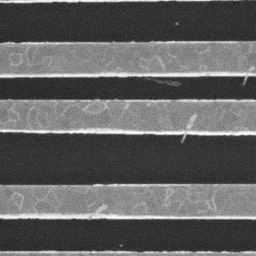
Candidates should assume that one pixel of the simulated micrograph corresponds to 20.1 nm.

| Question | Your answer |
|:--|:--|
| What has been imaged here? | lines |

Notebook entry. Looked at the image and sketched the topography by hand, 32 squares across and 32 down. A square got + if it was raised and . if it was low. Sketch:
................................
................................
................................
................................
................................
++++++++++++++++++++++++++++++++
++++++++++++++++++++++++++++++++
++++++++++++++++++++++++++++++++
++++++++++++++++++++++++++++++++
................................
................................
................................
................................
++++++++++++++++++++++++++++++++
++++++++++++++++++++++++++++++++
++++++++++++++++++++++++++++++++
.....++.++....++++++++++++++++++
................................
................................
................................
................................
................................
................................
++++++++++++++++++++++++++++++++
++++++++++++++++++++++++++++++++
++++++++++++++++++++++++++++++++
++++++++++++++++++++++++++++++++
................................
................................
................................
................................
................................